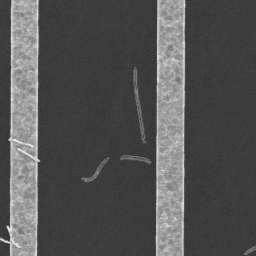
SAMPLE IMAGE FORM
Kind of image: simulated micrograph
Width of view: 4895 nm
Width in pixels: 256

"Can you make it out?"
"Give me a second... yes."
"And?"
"wiring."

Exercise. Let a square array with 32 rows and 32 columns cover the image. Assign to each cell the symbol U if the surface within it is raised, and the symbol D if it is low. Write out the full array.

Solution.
DUUUUDDDDDDDDDDDDDDDUUUDDDDDDDDD
DUUUUDDDDDDDDDDDDDDDUUUDDDDDDDDD
DUUUUDDDDDDDDDDDDDDDUUUDDDDDDDDD
DUUUUDDDDDDDDDDDDDDDUUUDDDDDDDDD
DUUUUDDDDDDDDDDDDDDDUUUDDDDDDDDD
DUUUUDDDDDDDDDDDDDDDUUUDDDDDDDDD
DUUUUDDDDDDDDDDDDDDDUUUDDDDDDDDD
DUUUUDDDDDDDDDDDDDDDUUUDDDDDDDDD
DUUUUDDDDDDDDDDDDDDDUUUDDDDDDDDD
DUUUUDDDDDDDDDDDDDDDUUUDDDDDDDDD
DUUUUDDDDDDDDDDDDDDDUUUDDDDDDDDD
DUUUUDDDDDDDDDDDDDDDUUUDDDDDDDDD
DUUUUDDDDDDDDDDDDDDDUUUDDDDDDDDD
DUUUUDDDDDDDDDDDDDDDUUUDDDDDDDDD
DUUUUDDDDDDDDDDDDDDDUUUDDDDDDDDD
DUUUUDDDDDDDDDDDDDDDUUUDDDDDDDDD
DUUUUDDDDDDDDDDDDDDDUUUDDDDDDDDD
DUUUUDDDDDDDDDDDDDDDUUUDDDDDDDDD
DUUUUDDDDDDDDDDDDDDDUUUDDDDDDDDD
DUUUUDDDDDDDDDDDDDDDUUUDDDDDDDDD
DUUUUDDDDDDDDDDDDDDDUUUDDDDDDDDD
DUUUUDDDDDDDDDDDDDDDUUUDDDDDDDDD
DUUUUDDDDDDDDDDDDDDDUUUDDDDDDDDD
DUUUUDDDDDDDDDDDDDDDUUUDDDDDDDDD
DUUUUDDDDDDDDDDDDDDDUUUDDDDDDDDD
DUUUUDDDDDDDDDDDDDDDUUUDDDDDDDDD
DUUUUDDDDDDDDDDDDDDDUUUDDDDDDDDD
DUUUUDDDDDDDDDDDDDDDUUUDDDDDDDDD
DUUUUDDDDDDDDDDDDDDDUUUDDDDDDDDD
DUUUUDDDDDDDDDDDDDDDUUUDDDDDDDDD
DUUUUDDDDDDDDDDDDDDDUUUDDDDDDDDD
DUUUDDDDDDDDDDDDDDDDUUUDDDDDDDDD